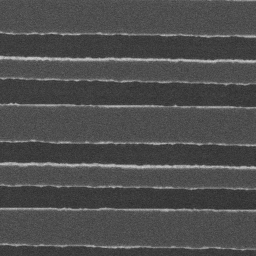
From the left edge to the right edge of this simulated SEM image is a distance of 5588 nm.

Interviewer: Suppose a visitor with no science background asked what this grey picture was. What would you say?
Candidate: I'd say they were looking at lines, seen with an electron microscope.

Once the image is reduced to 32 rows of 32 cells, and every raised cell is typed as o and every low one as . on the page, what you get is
oooooooooooooooooooooooooooooooo
oooooooooooooooooooooooooooooooo
oooooooooooooooooooooooooooooooo
oooooooooooooooooooooooooooooooo
........................oooooooo
................................
................................
ooooooooooooooooooooooo.........
oooooooooooooooooooooooooooooooo
oooooooooooooooooooooooooooooooo
............................ooo.
................................
................................
oooooooooooooooooooooooooooooooo
oooooooooooooooooooooooooooooooo
oooooooooooooooooooooooooooooooo
oooooooooooooooooooooooooooooooo
oooooooooooooooooooooooooooooooo
................................
................................
................................
oooooooooooooooooooooooooooooooo
oooooooooooooooooooooooooooooooo
.......................oo...oooo
................................
................................
oooooooooooooooooooooooooooooooo
oooooooooooooooooooooooooooooooo
oooooooooooooooooooooooooooooooo
oooooooooooooooooooooooooooooooo
oooooooooooooooooooooooooooooooo
................................